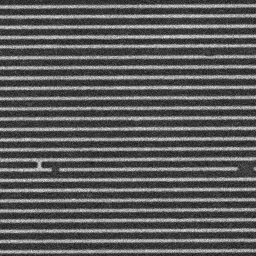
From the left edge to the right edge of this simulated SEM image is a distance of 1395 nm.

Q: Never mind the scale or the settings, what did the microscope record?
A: parallel lines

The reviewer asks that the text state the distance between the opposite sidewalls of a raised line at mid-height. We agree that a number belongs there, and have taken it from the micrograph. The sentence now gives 16.4 nanometres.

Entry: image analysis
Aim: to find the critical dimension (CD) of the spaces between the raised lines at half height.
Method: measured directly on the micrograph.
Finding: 38.2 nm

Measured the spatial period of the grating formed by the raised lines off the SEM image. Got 0.0557 micrometres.